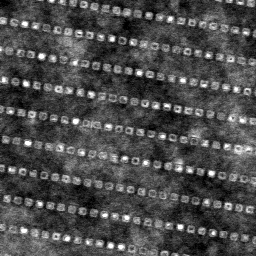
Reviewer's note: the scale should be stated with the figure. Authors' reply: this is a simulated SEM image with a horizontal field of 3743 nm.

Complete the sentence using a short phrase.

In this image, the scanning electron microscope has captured a regular array of raised bodies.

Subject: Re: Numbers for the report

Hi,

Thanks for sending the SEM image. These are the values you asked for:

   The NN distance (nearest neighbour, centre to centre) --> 159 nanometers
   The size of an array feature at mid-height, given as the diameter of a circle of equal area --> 7.48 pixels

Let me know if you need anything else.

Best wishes